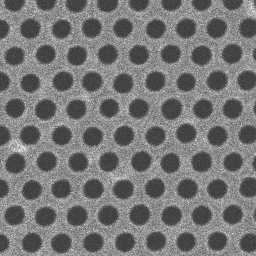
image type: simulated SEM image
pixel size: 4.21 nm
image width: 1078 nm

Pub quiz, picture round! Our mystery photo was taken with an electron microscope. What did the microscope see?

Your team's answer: a regular array of holes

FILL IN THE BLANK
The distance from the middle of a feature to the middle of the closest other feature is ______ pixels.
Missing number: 29.9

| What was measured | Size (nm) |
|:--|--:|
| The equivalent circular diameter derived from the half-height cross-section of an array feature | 84.5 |